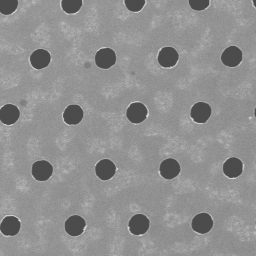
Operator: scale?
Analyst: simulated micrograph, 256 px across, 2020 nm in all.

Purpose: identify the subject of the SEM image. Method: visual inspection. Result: a regular array of holes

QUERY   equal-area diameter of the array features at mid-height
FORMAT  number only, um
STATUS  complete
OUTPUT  0.165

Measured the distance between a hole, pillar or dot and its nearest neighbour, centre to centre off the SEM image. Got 500 nm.